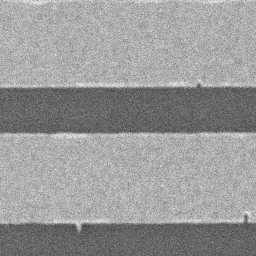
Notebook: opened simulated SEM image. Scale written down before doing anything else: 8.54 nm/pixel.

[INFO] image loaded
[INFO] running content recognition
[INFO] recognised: one or a few lines or trenches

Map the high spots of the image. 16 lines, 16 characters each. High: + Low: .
++++++++++++++++
++++++++++++++++
++++++++++++++++
++++++++++++++++
++++++++++++++++
................
................
................
++++++++++++++++
++++++++++++++++
++++++++++++++++
++++++++++++++++
++++++++++++++++
++++++++++++++++
................
................